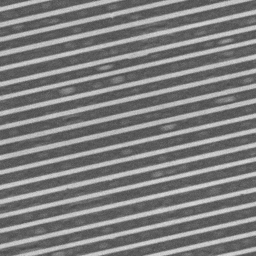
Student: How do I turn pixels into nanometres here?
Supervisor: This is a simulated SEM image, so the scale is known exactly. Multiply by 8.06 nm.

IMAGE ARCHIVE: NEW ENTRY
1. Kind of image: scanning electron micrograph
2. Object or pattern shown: parallel lines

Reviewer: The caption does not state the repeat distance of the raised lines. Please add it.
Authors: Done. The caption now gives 116 nm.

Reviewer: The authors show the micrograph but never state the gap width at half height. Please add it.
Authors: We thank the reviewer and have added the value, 0.0856 microns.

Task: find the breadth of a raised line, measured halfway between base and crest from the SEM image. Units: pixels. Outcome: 3.91